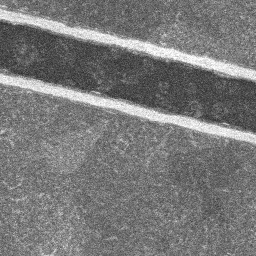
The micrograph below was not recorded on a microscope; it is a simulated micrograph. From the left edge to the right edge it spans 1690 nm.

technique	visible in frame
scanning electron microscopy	one or a few lines or trenches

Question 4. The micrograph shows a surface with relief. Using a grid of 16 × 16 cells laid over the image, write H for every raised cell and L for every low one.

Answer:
HHHHHHHHHHHHHHHH
LLLHHHHHHHHHHHHH
LLLLLLLHHHHHHHHH
LLLLLLLLLLLHHHHH
LLLLLLLLLLLLLLLH
HHHLLLLLLLLLLLLL
HHHHHHHLLLLLLLLL
HHHHHHHHHHHLLLLL
HHHHHHHHHHHHHHHL
HHHHHHHHHHHHHHHH
HHHHHHHHHHHHHHHH
HHHHHHHHHHHHHHHH
HHHHHHHHHHHHHHHH
HHHHHHHHHHHHHHHH
HHHHHHHHHHHHHHHH
HHHHHHHHHHHHHHHH